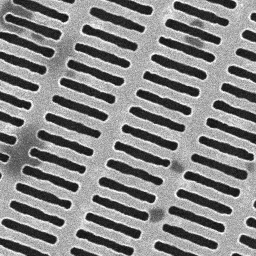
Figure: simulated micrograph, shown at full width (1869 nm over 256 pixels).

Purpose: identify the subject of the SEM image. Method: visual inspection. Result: a regular array of holes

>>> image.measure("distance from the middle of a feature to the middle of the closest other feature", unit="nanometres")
139